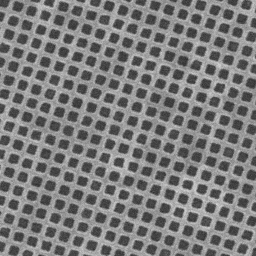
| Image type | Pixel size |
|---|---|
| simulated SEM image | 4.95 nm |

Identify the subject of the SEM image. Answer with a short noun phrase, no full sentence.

a regular array of holes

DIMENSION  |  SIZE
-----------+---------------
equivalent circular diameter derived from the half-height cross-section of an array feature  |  58.4 nm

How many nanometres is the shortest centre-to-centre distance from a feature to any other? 70.3